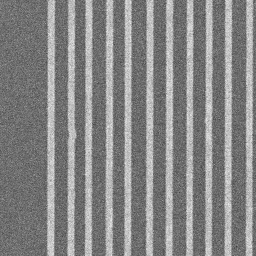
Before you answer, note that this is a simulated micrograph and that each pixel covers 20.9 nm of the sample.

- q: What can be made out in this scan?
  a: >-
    parallel lines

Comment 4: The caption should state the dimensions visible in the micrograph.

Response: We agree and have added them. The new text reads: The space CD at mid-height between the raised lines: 291 nanometres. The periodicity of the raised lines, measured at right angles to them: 415 nanometres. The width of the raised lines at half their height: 0.134 µm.